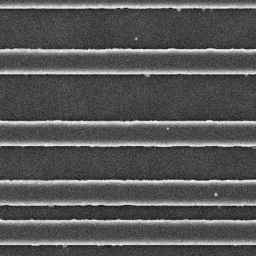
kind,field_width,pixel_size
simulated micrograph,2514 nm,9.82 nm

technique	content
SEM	lines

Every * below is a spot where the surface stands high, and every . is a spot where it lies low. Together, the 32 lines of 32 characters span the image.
********************************
................................
................................
................................
................................
................................
********************************
********************************
********************************
................................
................................
................................
................................
................................
................................
********************************
********************************
********************************
................................
................................
................................
................................
................................
********************************
********************************
********************************
................................
................................
********************************
********************************
********************************
................................